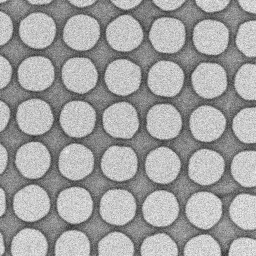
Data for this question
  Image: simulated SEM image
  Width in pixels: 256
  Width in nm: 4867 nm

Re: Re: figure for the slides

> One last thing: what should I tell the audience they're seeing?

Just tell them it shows an array of small figures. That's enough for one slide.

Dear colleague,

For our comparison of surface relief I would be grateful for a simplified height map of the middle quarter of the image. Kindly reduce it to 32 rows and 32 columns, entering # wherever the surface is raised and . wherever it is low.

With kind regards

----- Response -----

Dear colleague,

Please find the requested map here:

#######....#######....#######...
########...########..########...
########..#########..#########..
########..#########..#########..
########..#########..#########..
########...########..########...
.#####.....#######....#######...
.............###.......#####....
................................
..###...........................
#######.....#####......####.....
########...#######...#######....
########..########...########...
########..########...########...
########..#########..########..#
#######...#########..########...
#######...########...########...
.#####.....######.....#######...
...............##......####.....
................................
.####...........................
######.....######......####.....
#######...########...#######....
#######...########...########...
#######..#########..#########..#
#######..#########..#########..#
#######...########..#########..#
######....########...#######...#
.####......######....#######....
.......................####.....
................................
#####.......##..................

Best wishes